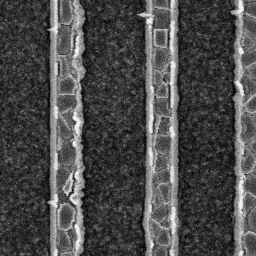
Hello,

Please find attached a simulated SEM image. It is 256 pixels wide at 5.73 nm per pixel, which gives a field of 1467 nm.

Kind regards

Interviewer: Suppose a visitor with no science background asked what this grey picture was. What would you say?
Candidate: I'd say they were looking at one or a few lines or trenches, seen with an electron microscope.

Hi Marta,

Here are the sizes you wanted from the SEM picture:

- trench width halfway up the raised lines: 372 nanometers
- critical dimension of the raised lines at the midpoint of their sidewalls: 155 nm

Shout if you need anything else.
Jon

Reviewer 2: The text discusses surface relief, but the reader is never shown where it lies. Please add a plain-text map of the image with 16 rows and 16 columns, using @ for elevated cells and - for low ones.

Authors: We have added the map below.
---@@----@@----@
---@@----@@----@
---@@----@@----@
---@@----@@----@
---@@----@@----@
---@@----@@----@
---@@----@@----@
---@@----@@----@
---@@----@@----@
---@@----@@----@
---@@----@@----@
---@@----@@----@
---@@----@@----@
---@@----@@----@
---@@----@@----@
---@@----@@----@